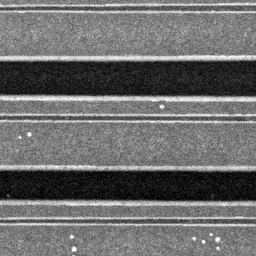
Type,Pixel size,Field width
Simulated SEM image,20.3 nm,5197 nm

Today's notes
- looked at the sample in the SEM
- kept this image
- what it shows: lines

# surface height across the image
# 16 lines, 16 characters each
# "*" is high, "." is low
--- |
****************
****************
****************
****************
................
................
****************
****************
****************
****************
................
................
................
****************
****************
****************